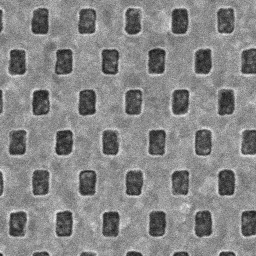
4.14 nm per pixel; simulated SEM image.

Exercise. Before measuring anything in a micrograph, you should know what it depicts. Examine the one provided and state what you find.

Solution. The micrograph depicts a regular array of holes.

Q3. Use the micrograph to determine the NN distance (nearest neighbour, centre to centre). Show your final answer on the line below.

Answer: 191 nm